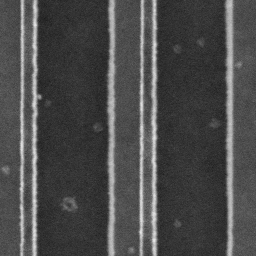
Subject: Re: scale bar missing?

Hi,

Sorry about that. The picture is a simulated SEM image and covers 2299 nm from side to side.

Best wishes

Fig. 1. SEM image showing lines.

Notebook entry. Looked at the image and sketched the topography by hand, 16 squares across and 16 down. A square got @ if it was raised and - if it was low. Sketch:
@@-----@@@----@@
@@-----@@@----@@
@@-----@@@----@@
@@-----@@@----@@
@@-----@@@----@@
@@-----@@@----@@
@@-----@@@----@@
@@-----@@@----@@
@@-----@@@----@@
@@-----@@@----@@
@@-----@@@----@@
@@-----@@@----@@
@@-----@@@----@@
@@-----@@@----@@
@@-----@@@----@@
@@-----@@@----@@